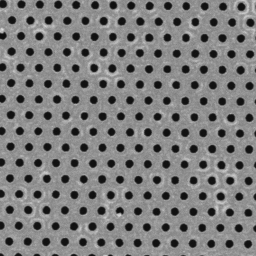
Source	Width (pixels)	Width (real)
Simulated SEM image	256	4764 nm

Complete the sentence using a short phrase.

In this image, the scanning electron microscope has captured a regular array of holes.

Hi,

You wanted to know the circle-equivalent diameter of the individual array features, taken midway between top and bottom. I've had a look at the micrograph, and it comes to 157 nm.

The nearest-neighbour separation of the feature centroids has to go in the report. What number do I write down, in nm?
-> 336